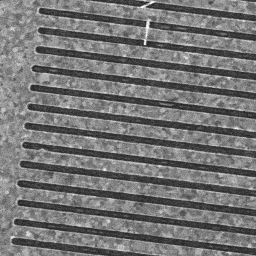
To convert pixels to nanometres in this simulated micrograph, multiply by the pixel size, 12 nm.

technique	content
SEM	parallel lines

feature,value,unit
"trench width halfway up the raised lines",86.1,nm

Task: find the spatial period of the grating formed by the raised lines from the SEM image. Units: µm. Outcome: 0.231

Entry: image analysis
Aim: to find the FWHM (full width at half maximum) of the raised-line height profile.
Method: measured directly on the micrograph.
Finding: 138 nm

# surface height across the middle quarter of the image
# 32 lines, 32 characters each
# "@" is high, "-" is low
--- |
@@@@@@@@@@@@@@@@@@@-------------
-----@@@@@@@@@@@@@@@@@@@@@------
-----------@@@@@@@@@@@@@@@@@@@@@
@@@-----------------@@@@@@@@@@@@
@@@@@@@@@@@-----------------@@@@
@@@@@@@@@@@@@@@@@@@-------------
-----@@@@@@@@@@@@@@@@@@@@@@-----
-------------@@@@@@@@@@@@@@@@@@@
@@@@----------------@@@@@@@@@@@@
@@@@@@@@@@@@-----------------@@@
@@@@@@@@@@@@@@@@@@@@------------
------@@@@@@@@@@@@@@@@@@@@@@@---
--------------@@@@@@@@@@@@@@@@@@
@@@@@@----------------@@@@@@@@@@
@@@@@@@@@@@@@@----------------@@
@@@@@@@@@@@@@@@@@@@@@@----------
------@@@@@@@@@@@@@@@@@@@@@@@@--
---------------@@@@@@@@@@@@@@@@@
@@@@@@@----------------@@@@@@@@@
@@@@@@@@@@@@@@@----------------@
-@@@@@@@@@@@@@@@@@@@@@@---------
---------@@@@@@@@@@@@@@@@@@@@@@-
-----------------@@@@@@@@@@@@@@@
@@@@@@@@@----------------@@@@@@@
@@@@@@@@@@@@@@@-----------------
-@@@@@@@@@@@@@@@@@@@@@@---------
---------@@@@@@@@@@@@@@@@@@@@@@-
@----------------@@@@@@@@@@@@@@@
@@@@@@@@@@---------------@@@@@@@
@@@@@@@@@@@@@@@@@@--------------
--@@@@@@@@@@@@@@@@@@@@@@@@------
----------@@@@@@@@@@@@@@@@@@@@@@